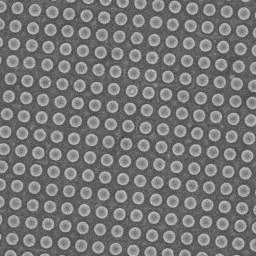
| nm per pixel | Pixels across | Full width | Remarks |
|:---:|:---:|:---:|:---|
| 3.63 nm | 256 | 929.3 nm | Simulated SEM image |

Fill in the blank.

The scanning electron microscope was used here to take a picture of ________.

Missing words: a regular array of raised bodies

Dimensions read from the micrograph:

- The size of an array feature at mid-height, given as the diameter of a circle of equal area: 44.3 nm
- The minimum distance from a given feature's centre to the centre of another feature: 62.2 nm